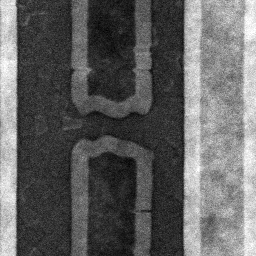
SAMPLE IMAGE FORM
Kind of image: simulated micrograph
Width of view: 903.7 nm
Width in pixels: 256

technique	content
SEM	one or a few lines or trenches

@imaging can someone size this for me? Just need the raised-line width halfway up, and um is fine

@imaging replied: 0.207